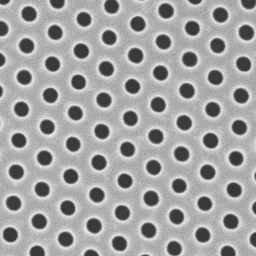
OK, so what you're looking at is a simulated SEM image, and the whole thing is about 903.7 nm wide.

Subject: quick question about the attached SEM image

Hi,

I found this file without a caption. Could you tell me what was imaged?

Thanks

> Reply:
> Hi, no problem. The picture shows a regular array of holes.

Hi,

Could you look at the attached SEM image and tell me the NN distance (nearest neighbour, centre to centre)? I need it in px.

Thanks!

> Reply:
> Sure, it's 31.1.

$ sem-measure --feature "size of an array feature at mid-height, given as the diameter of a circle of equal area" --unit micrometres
0.0532